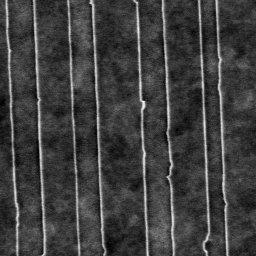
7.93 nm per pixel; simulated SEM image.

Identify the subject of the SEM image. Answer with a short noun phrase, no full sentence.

one or a few lines or trenches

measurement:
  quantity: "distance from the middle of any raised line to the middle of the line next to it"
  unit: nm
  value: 514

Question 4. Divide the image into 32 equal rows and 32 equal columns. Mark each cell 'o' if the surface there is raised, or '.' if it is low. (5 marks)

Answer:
o...ooooo..oooooo...ooooo..ooooo
o...ooooo...ooooo...ooooo..ooooo
o...ooooo...ooooo...ooooo..ooooo
o...ooooo...ooooo....oooo..ooooo
o...ooooo...ooooo...ooooo..ooooo
o...ooooo...ooooo....oooo..ooooo
o...ooooo...ooooo....oooo..ooooo
o....oooo...ooooo....oooo..ooooo
o....oooo...ooooo....oooo..ooooo
o....oooo...ooooo....oooo...oooo
o....oooo...ooooo....oooo..ooooo
o....oooo...oooooo...oooo..ooooo
o....oooo...oooooo...oooo...oooo
o....oooo...oooooo...oooo...oooo
o....oooo...oooooo...ooooo..oooo
o....oooo...oooooo...ooooo..oooo
oo...oooo...oooooo...ooooo..oooo
oo...oooo...oooooo...ooooo..oooo
oo...oooo...oooooo...ooooo..oooo
oo...oooo...oooooo...ooooo..oooo
oo...oooo...oooooo...ooooo..oooo
oo...ooooo..oooooo...ooooo..oooo
oo...ooooo...ooooo...ooooo..oooo
oo...ooooo...ooooo...ooooo..oooo
oo...ooooo...ooooo...ooooo..oooo
oo...ooooo...ooooo...ooooo..oooo
oo...ooooo...ooooo....oooo..oooo
oo...ooooo...ooooo....oooo..oooo
oo....oooo...ooooo....oooo..oooo
oo....oooo...ooooo....oooo..oooo
oo....oooo...ooooo....oooo..oooo
oo...ooooo...ooooo....oooo..oooo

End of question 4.